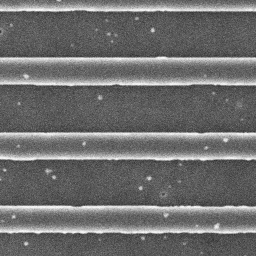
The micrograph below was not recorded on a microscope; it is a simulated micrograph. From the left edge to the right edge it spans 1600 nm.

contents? lines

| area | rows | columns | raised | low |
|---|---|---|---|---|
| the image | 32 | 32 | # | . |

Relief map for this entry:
################################
................................
................................
................................
................................
................................
................................
################################
################################
################################
....##########.#########...#####
................................
................................
................................
................................
................................
................................
################################
################################
################################
................................
................................
................................
................................
................................
................................
################################
################################
################################
................................
................................
................................